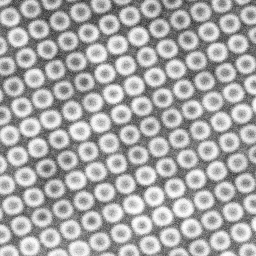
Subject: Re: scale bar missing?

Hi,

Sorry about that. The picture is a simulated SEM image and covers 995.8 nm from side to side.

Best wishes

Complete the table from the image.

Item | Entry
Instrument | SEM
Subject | a regular array of raised bodies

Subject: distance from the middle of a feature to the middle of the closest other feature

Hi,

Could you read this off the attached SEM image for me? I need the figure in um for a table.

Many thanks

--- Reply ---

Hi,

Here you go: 0.0851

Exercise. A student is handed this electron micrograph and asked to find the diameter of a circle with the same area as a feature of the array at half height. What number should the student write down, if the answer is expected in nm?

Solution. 65.6